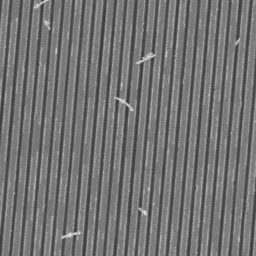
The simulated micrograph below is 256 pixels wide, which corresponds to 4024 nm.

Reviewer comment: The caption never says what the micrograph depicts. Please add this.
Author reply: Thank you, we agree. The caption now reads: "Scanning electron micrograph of parallel lines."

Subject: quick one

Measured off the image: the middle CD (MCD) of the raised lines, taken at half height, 108 nm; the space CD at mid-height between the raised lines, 0.0548 micrometres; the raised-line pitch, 163 nm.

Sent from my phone